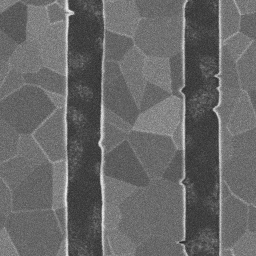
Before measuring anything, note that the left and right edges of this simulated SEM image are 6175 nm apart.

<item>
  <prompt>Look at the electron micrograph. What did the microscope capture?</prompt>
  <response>one or a few lines or trenches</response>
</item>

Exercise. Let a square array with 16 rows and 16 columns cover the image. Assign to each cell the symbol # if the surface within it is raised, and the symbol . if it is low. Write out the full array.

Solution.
####...#####..##
####...#####..##
####...####...##
####..#####...##
####..#####...##
####..#####...##
####..######..##
####..######..##
####..#####...##
####..#####...##
####..######..##
####..#####...##
####..######..##
####..######..##
####..######..##
####..#####...##